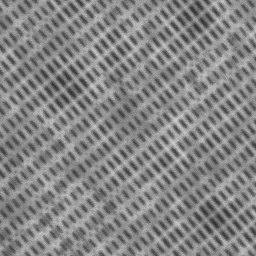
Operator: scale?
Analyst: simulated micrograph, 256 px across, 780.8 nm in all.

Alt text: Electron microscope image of a regular array of holes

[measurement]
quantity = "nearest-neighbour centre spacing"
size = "23.9 nm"